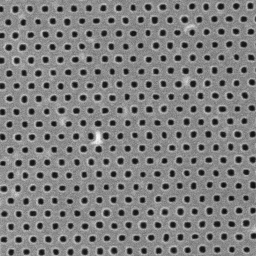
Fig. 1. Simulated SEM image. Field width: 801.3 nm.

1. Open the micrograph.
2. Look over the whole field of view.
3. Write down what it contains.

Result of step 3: a regular array of holes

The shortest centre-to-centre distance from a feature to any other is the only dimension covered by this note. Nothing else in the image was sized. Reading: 44.1 nm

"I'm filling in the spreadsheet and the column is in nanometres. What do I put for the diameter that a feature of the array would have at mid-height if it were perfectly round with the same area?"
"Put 20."